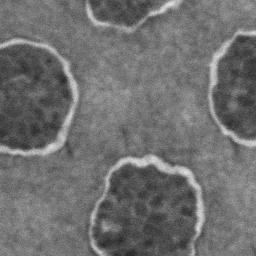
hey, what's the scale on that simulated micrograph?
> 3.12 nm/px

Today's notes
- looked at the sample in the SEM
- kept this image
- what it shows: raised bodies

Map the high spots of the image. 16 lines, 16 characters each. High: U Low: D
DDDDDUUUUUDDDDDD
DDDDDDUUUDDDDDDD
DDDDDDDDDDDDDDUU
UUUUDDDDDDDDDDUU
UUUUDDDDDDDDDUUU
UUUUUDDDDDDDDUUU
UUUUUDDDDDDDDUUU
UUUUDDDDDDDDDDUU
UUUUDDDDDDDDDDUU
DUDDDDDDDDDDDDDD
DDDDDDDUUUUDDDDD
DDDDDDDUUUUUDDDD
DDDDDDUUUUUUUDDD
DDDDDDUUUUUUUDDD
DDDDDDUUUUUUDDDD
DDDDDDUUUUUUDDDD